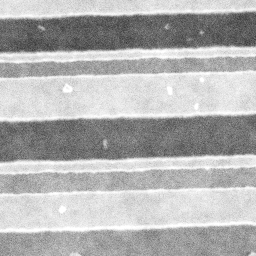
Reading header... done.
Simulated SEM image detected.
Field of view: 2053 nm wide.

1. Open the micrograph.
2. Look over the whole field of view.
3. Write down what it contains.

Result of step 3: lines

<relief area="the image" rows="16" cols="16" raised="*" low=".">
****************
................
................
****************
****************
****************
****************
................
................
................
****************
****************
****************
****************
................
................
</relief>